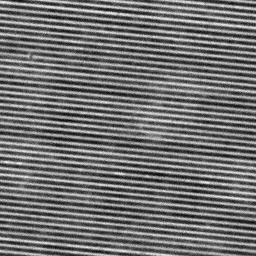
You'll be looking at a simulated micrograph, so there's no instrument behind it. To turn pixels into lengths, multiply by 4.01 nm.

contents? parallel lines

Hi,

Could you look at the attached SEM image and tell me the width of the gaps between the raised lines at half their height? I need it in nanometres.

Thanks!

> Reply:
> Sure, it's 18.4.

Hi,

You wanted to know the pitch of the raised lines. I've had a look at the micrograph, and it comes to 25.5 nm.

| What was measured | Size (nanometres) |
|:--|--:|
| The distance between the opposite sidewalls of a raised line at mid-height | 7.5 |